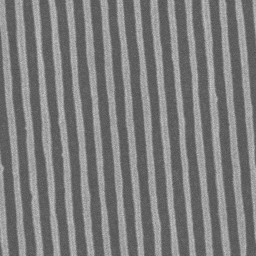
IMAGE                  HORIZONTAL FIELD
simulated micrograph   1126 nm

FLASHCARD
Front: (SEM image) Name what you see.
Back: parallel lines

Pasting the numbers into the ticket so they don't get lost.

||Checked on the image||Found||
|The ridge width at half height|26.3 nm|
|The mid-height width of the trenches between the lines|0.0487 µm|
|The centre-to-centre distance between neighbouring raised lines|74.4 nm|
